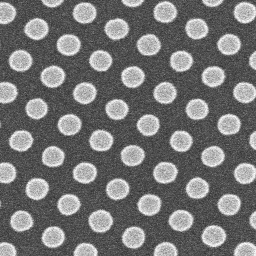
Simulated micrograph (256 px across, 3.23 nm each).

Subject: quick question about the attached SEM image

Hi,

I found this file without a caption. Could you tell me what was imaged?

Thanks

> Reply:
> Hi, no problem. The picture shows a regular array of raised bodies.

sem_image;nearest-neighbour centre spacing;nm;115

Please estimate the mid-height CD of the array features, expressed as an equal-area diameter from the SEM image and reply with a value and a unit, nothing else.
67.1 nanometers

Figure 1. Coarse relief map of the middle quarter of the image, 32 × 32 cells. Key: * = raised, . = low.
.......****................****.
.........*.....****.........**..
...............*****............
...............*****............
...............****.............
....***.........**.....****.....
...*****...............*****....
...*****...............*****....
...****................****.....
....**......***.........***.....
...........*****...............*
...........*****...............*
...........****................*
***.........**......***.........
****...............*****........
****..............******........
****...............****.........
**.....****.........**.....****.
.......*****...............*****
.......*****...............*****
.......*****...............****.
........**.....****.........**..
..............******............
...............*****............
...............****.............
...****................****.....
...*****...............*****....
...*****...............*****....
...****................****.....
.....*......***.........**.....*
...........*****...............*
...........*****...............*